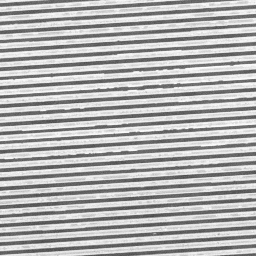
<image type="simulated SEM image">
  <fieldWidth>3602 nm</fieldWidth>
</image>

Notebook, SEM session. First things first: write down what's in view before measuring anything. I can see parallel lines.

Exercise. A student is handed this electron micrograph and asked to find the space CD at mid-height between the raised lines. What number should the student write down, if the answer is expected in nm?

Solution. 82.5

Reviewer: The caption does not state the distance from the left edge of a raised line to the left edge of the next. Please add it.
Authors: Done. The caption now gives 9.18 px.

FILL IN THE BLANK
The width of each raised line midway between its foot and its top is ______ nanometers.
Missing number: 54.4